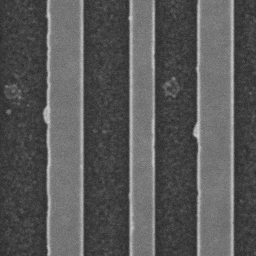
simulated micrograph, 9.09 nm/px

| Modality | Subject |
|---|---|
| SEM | lines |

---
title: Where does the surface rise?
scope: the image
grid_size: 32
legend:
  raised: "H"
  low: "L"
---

LLLLLLHHHHLLLLLLHHHLLLLLLHHHHLLL
LLLLLLHHHHLLLLLLHHHLLLLLLHHHHLLL
LLLLLLHHHHLLLLLLHHHLLLLLLHHHHLLL
LLLLLLHHHHLLLLLLHHHLLLLLLHHHHLLL
LLLLLLHHHHLLLLLLHHHLLLLLLHHHHLLL
LLLLLLHHHHLLLLLLHHHLLLLLLHHHHLLL
LLLLLLHHHHLLLLLLHHHLLLLLLHHHHLLL
LLLLLLHHHHLLLLLLHHHLLLLLLHHHHLLL
LLLLLLHHHHLLLLLLHHHLLLLLLHHHHLLL
LLLLLLHHHHLLLLLLHHHLLLLLLHHHHLLL
LLLLLLHHHHLLLLLLHHHLLLLLLHHHHLLL
LLLLLLHHHHLLLLLLHHHLLLLLLHHHHLLL
LLLLLLHHHHLLLLLLHHHLLLLLLHHHHLLL
LLLLLLHHHHLLLLLLHHHLLLLLLHHHHLLL
LLLLLLHHHHLLLLLLHHHLLLLLLHHHHLLL
LLLLLLHHHHLLLLLLHHHLLLLLLHHHHLLL
LLLLLLHHHHLLLLLLHHHLLLLLLHHHHLLL
LLLLLLHHHHLLLLLLHHHLLLLLLHHHHLLL
LLLLLLHHHHLLLLLLHHHLLLLLLHHHHLLL
LLLLLLHHHHLLLLLLHHHLLLLLLHHHHLLL
LLLLLLHHHHLLLLLLHHHLLLLLLHHHHLLL
LLLLLLHHHHLLLLLLHHHLLLLLLHHHHLLL
LLLLLLHHHHLLLLLLHHHLLLLLLHHHHLLL
LLLLLLHHHHLLLLLLHHHLLLLLLHHHHLLL
LLLLLLHHHHLLLLLLHHHLLLLLLHHHHLLL
LLLLLLHHHHLLLLLLHHHLLLLLLHHHHLLL
LLLLLLHHHHLLLLLLHHHLLLLLLHHHHLLL
LLLLLLHHHHLLLLLLHHHLLLLLLHHHHLLL
LLLLLLHHHHLLLLLLHHHLLLLLLHHHHLLL
LLLLLLHHHHLLLLLLHHHLLLLLLHHHHLLL
LLLLLLHHHHLLLLLLHHHLLLLLLHHHHLLL
LLLLLLHHHHLLLLLLHHHLLLLLLHHHHLLL